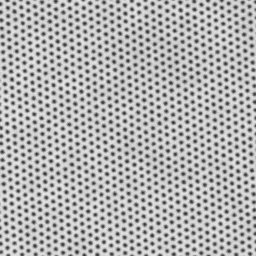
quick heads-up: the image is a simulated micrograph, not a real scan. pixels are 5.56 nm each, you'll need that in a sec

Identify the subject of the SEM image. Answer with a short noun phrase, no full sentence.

a regular array of holes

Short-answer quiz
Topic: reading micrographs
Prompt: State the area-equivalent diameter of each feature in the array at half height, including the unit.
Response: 0.0259 micrometres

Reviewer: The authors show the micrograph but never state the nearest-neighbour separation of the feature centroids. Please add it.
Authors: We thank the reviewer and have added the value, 7.61 px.